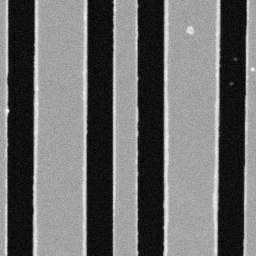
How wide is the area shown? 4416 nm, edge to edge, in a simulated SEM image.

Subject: lines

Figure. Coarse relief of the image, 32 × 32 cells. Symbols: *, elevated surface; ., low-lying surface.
*...*******...***....******....*
*...*******...***....******....*
*...*******...***....******....*
*...*******...***....******....*
*...*******...***....******....*
*...*******...***....******....*
*...*******...***....******....*
*...*******...***....******....*
*...*******...***....******....*
*...*******...***....******....*
*...*******...***....******....*
*...*******...***....******....*
*...*******...***....******....*
*...*******...***....******....*
*...*******...***....******....*
*...*******...***....******....*
*...*******...***....******....*
*...*******...***....******....*
*...*******...***....******....*
*...*******...***....******....*
*...*******...***....******....*
*...*******...***....******....*
*...*******...***....******....*
*...*******...***....******....*
*...*******...***....******....*
*...*******...***....******....*
*...*******...***....******....*
*...*******...***....******....*
*...*******...***....******....*
*...*******...***....******....*
*...*******...***....******...**
*...*******...***....******...**